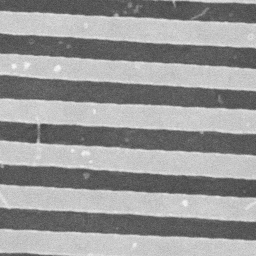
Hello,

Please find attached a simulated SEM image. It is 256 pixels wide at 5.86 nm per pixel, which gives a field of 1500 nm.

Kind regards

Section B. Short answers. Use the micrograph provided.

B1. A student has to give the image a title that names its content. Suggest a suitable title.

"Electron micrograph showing lines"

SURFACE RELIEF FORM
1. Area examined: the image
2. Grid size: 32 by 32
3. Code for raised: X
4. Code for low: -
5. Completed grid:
--------------------------------
XX------------------------------
XXXXXXXXXXXXXXXXXXXXX-----------
XXXXXXXXXXXXXXXXXXXXXXXXXXXXXXXX
------XXXXXXXXXXXXXXXXXXXXXXXXXX
---------------------XXXXXXXXXXX
--------------------------------
XXXXXXXXXXXX--------------------
XXXXXXXXXXXXXXXXXXXXXXXXXXXXXX--
--XXXXXXXXXXXXXXXXXXXXXXXXXXXXXX
-----------------XXXXXXXXXXXXXXX
--------------------------------
XX------------------------------
XXXXXXXXXXXXXXXXXXXXXXXXXX------
XXXXXXXXXXXXXXXXXXXXXXXXXXXXXXXX
----X----XXXXXXXXXXXXXXXXXXXXXXX
---------------------------XXXXX
--------------------------------
XXXXXXXXXXXXXXX-----------------
XXXXXXXXXXXXXXXXXXXXXXXXXXXXXXXX
-XXXXXXXXXXXXXXXXXXXXXXXXXXXXXXX
----------------XXXXXXXXXXXXXXXX
--------------------------------
XXXXXXX-------------------------
XXXXXXXXXXXXXXXXXXXXXXXXXX------
XXXXXXXXXXXXXXXXXXXXXXXXXXXXXXXX
----------XXXXXXXXXXXXXXXXXXXXXX
---------------------------XXXXX
--------------------------------
XXXXXXXXXXXXXXXXXX--------------
XXXXXXXXXXXXXXXXXXXXXXXXXXXXXXXX
XXXXXXXXXXXXXXXXXXXXXXXXXXXXXXXX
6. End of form